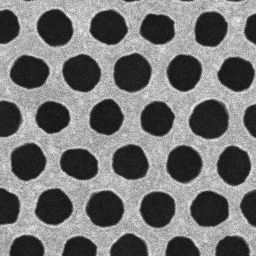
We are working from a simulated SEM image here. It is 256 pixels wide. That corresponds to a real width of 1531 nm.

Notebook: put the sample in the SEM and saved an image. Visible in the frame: a regular array of holes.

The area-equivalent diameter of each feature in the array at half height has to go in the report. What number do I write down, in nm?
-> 217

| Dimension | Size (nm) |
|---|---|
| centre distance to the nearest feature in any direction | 304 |